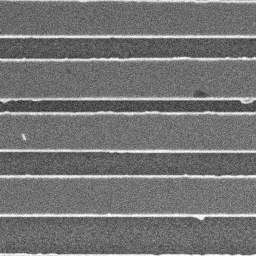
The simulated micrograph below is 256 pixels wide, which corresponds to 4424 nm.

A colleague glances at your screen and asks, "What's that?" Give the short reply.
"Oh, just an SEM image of lines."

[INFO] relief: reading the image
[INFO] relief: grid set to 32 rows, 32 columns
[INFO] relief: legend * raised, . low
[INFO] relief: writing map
********************************
********************************
********************************
********************************
********************************
................................
................................
********************************
********************************
********************************
********************************
********************************
*.............................*.
................................
********************************
********************************
********************************
********************************
********************************
................................
................................
................................
********************************
********************************
********************************
********************************
********************************
................................
................................
................................
................................
................................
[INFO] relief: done